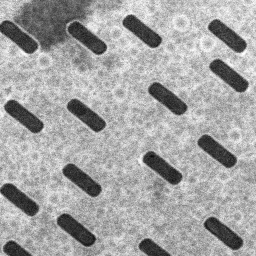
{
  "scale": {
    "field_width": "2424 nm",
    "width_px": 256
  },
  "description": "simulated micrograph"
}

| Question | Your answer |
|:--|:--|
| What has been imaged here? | a regular array of holes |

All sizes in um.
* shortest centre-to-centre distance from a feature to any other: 0.533